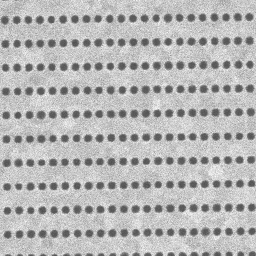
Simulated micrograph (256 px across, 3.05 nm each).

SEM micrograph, a regular array of holes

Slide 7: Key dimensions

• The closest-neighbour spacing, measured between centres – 35.4 nanometres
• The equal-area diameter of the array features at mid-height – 23.6 nanometers